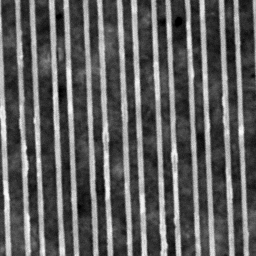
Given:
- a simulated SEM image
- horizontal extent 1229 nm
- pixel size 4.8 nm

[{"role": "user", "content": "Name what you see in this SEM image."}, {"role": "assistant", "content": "parallel lines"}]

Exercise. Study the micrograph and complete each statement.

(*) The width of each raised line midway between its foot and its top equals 0.0204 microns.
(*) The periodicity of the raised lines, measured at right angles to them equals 81.1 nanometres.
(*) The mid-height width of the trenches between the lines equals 69.5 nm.